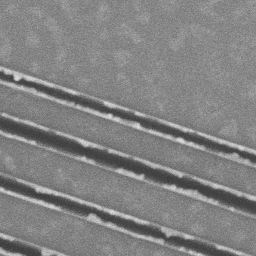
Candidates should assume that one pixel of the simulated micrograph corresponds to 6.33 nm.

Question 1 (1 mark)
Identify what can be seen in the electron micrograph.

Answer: parallel lines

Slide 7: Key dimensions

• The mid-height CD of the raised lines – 112 nm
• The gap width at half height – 234 nm